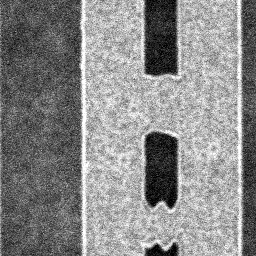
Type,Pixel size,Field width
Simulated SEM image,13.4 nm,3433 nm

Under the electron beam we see one or a few lines or trenches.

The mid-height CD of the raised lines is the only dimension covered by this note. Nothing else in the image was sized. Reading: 821 nanometres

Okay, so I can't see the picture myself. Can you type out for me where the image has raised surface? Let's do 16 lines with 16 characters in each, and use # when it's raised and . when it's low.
.....####..####.
.....####..####.
.....####..####.
.....####..####.
.....####..####.
.....##########.
.....##########.
.....##########.
.....####..####.
.....####..####.
.....####..####.
.....####..####.
.....####..####.
.....##########.
.....##########.
.....####..####.